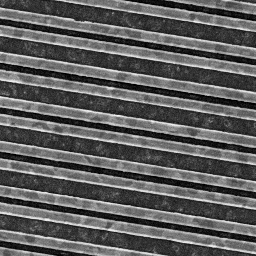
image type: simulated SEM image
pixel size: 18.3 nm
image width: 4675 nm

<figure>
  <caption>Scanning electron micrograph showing parallel lines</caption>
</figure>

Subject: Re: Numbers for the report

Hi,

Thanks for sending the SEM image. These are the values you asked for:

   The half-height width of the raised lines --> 169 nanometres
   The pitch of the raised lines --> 399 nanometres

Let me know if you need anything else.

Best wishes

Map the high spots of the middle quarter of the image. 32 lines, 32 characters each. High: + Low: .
+++++...........................
+++++++++++.....................
...++++++++++++++...............
..........++++++++++++++........
++..............++++++++++++++..
+++++++++.............++++++++++
.+++++++++++++++.............+++
.......+++++++++++++++..........
.............+++++++++++++++....
...................+++++++++++++
..........................++++++
++++............................
++++++++++......................
...++++++++++++++...............
.........++++++++++++++.........
++.............++++++++++++++...
++++++++..............++++++++++
++++++++++++++..............++++
.......++++++++++++++...........
.............+++++++++++++......
...................+++++++++++++
.........................+++++++
+++............................+
++++++++++......................
..++++++++++++++................
........++++++++++++++..........
+..............++++++++++++++...
++++++++.............+++++++++++
++++++++++++++.............+++++
......+++++++++++++.............
.............++++++++++++++.....
..................++++++++++++++